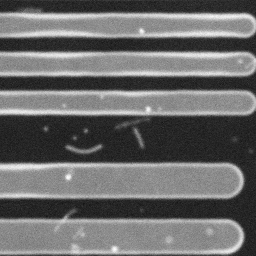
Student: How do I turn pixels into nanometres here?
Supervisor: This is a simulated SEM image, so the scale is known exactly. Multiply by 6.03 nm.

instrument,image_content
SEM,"groups of lines, slits or small figures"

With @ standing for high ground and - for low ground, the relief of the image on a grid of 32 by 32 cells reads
--------------------------------
--------------------------------
@@@@@@@@@@@@@@@@@@@@@@@@@@@@@@@@
@@@@@@@@@@@@@@@@@@@@@@@@@@@@@@@@
@@@--------@@@@@@@@@@--------@@-
--------------------------------
--------------------------------
@@@@@@@@@@@@@@@@@@@@@@@@@@@@@@@@
@@@@@@@@@@@@@@@@@@@@@@@@@@@@@@@@
--------------------------------
--------------------------------
---------------------@@@@@@@@@@-
@@@@@@@@@@@@@@@@@@@@@@@@@@@@@@@@
@@@@@@@@@@@@@@@@@@@@@@@@@@@@@@@@
--------------------------------
--------------------------------
--------------------------------
--------------------------------
--------------------------------
--------------------------------
--------------------@@@@@-------
@@@@@@@@@@@@@@@@@@@@@@@@@@@@@@--
@@@@@@@@@@@@@@@@@@@@@@@@@@@@@@--
@@@@@@@@@@@@@@@@@@@@@@@@@@@@@@--
@@@@@@@@@@@@@@@@@@@@@@@@@@@@@---
--------------------------------
--------------------------------
--@@@@-@@------------@@---------
@@@@@@@@@@@@@@@@@@@@@@@@@@@@@@--
@@@@@@@@@@@@@@@@@@@@@@@@@@@@@@--
@@@@@@@@@@@@@@@@@@@@@@@@@@@@@@--
@@@@@@@@@@@@@@@@@@@@@@@@@@@@@---